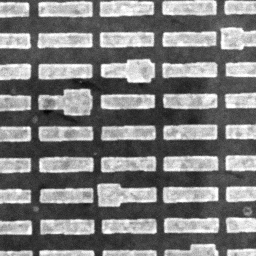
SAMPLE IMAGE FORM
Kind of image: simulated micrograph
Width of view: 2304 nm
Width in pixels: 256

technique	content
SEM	wiring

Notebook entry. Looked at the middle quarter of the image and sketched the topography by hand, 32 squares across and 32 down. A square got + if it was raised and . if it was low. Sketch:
+++++++...++++++++++++...+++++++
+++++++...+++++++++++++..+++++++
+++++++...+++++++++++++..+++++++
................++++++..........
................................
................................
................................
++++++..........................
+++++++...++++++++++++...+++++++
+++++++...++++++++++++...+++++++
+++++++...++++++++++++...+++++++
++++++..........................
................................
................................
................................
................................
+++++++...+++++++++++++..+++++++
+++++++...+++++++++++++..+++++++
+++++++...+++++++++++++..+++++++
................................
................................
................................
................................
................................
+++++++...+++++++++++++..+++++++
+++++++...+++++++++++++..+++++++
+++++++...++++..................
................................
................................
................................
.........+++++..................
+++++++..++++++++++++++..+++++++